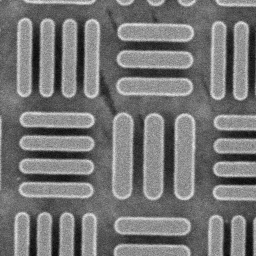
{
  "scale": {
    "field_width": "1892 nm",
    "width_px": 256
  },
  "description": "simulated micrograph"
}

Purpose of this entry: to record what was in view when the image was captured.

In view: groups of lines, slits or small figures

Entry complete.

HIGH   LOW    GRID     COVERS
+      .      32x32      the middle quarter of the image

+++..+++......++++++++++++++++++
+++..+++........................
+++..+++........................
+++..+++........................
+++..+++......++++++++++++++++++
+++..+++.....+++++++++++++++++++
+++..+++......++++++++++++++++++
+++..+++...............++++++++.
................................
................................
................................
................................
++++++........++......+.........
+++++++......++++....+++....++++
+++++++......++++...+++++...++++
+++++++......++++...+++++...++++
.............++++...+++++...++++
............+++++...+++++...++++
+++++++.....+++++...+++++...++++
+++++++.....+++++...+++++...++++
+++++++.....+++++...+++++...++++
++++++......+++++...+++++...++++
............+++++...+++++...++++
............+++++...+++++...++++
+++++++.....+++++...+++++...++++
+++++++.....+++++...+++++...++++
+++++++.....+++++...+++++...++++
............+++++...+++++...++++
............+++++...+++++...++++
............+++++...++++....++++
+++++++.....+++++...++++....++++
+++++++.....+++++...++++....++++